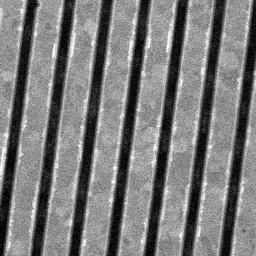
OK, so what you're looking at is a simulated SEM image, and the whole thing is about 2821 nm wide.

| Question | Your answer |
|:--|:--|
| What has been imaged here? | parallel lines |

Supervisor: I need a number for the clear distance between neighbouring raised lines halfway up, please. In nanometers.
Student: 130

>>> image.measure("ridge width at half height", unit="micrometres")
0.288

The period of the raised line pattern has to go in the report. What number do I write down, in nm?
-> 412